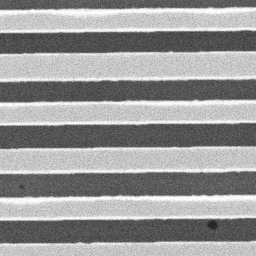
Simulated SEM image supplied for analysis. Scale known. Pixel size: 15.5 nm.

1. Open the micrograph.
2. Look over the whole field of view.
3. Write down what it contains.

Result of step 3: lines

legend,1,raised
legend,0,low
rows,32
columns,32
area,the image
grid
00000000000000000000000000000000
11111111111111111111111111111111
11111111111111111111111111111111
11111111111111111111111111111111
00000000000000000000000000000000
00000000000000000000000000000000
00000000000000000000000000000000
11111111111111111111111111111111
11111111111111111111111111111111
11111111111111111111111111111111
00000000000000000000000000000000
00000000000000000000000000000000
00000000000000000000000000000000
11111111111111111111111111111111
11111111111111111111111111111111
11111110000000000000000000000000
00000000000000000000000000000000
00000000000000000000000000000000
00000000000000000000010011111111
11111111111111111111111111111111
11111111111111111111111111111111
11111111111000000000000000000000
00000000000000000000000000000000
00000000000000000000000000000000
00000000000000000000000000000000
11111111111111111111111111111111
11111111111111111111111111111111
00000000000000000000000000000000
00000000000000000000000000000000
00000000000000000000000000000000
00000000011111111111111111111111
11111111111111111111111111111111